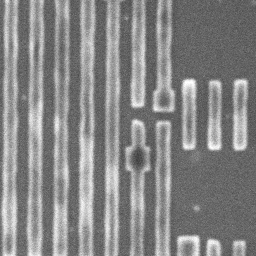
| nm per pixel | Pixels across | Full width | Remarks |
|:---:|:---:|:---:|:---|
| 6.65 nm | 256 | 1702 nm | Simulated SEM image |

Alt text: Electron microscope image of wiring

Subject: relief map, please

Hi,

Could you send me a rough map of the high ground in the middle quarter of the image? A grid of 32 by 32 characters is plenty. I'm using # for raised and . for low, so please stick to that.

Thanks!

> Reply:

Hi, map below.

#....##....###...###....##......
#....##....###...###....##......
#....##....###...###....##......
#....##....###...###....##......
#....##....###...###....##....##
#....##....###...###....##....##
#....##....###...###...####...##
#...###....###...###...####...##
#...###....###...###...####...##
#...###....###...###...####...##
#...###....###...##....####...##
#...###....###.........####...##
#....##....###................##
#....##....###................##
#...###....###...##.....##....##
#...###....###...###...###....##
#...###....###...###...###....##
#...###....###...###...###....##
#...###....##....###...###....##
#...###....###...###...###....##
#...###....###...###...###....##
#...###....###..#####..###......
#...###....###..#####...##......
#...###....###..#####..###......
#...###....###..#####..###......
#...###....##...#####..###......
#...###....##...#####..###......
#...###....##....###...###......
#...###....##....###...###......
#...###....##....###...###......
#...###....##....###...###......
#...###....##....###...###......